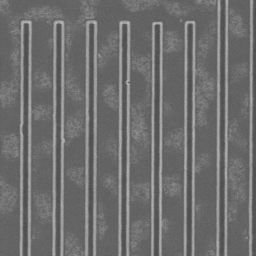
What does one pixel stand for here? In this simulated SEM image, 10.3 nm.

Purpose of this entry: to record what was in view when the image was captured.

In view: parallel lines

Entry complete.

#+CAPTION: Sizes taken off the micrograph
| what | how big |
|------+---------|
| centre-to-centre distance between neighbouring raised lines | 338 nm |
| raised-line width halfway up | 77.4 nm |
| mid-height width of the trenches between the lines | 25.2 pixels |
